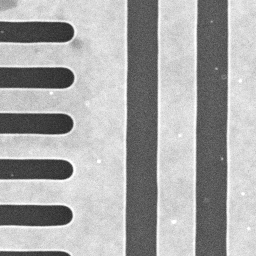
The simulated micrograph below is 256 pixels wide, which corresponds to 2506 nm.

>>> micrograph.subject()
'groups of lines, slits or small figures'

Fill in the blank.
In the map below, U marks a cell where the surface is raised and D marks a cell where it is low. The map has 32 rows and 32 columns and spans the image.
UUUUUUUUUUUUUUUUDDDDUUUUUDDDDUUU
UUUUUUUUUUUUUUUUDDDDUUUUUDDDDUUU
UUUUUUUUUUUUUUUUDDDDUUUUUDDDDUUU
DDDDDDDDDUUUUUUUDDDDUUUUUDDDDUUU
DDDDDDDDDUUUUUUUDDDDUUUUUDDDDUUU
UUUUUUUUUUUUUUUUDDDDUUUUUDDDDUUU
UUUUUUUUUUUUUUUUDDDDUUUUUDDDDUUU
UUUUUUUUUUUUUUUUDDDDUUUUUDDDDUUU
DDDDDDDDUUUUUUUUDDDDUUUUUDDDDUUU
DDDDDDDDDUUUUUUUDDDDUUUUUDDDDUUU
DDDDDDDDDUUUUUUUDDDDUUUUUDDDDUUU
UUUUUUUUUUUUUUUUDDDDUUUUUDDDDUUU
UUUUUUUUUUUUUUUUDDDDUUUUUDDDDUUU
UUUUUUUUUUUUUUUUDDDDUUUUUDDDDUUU
DDDDDDDDDUUUUUUUDDDDUUUUUDDDDUUU
DDDDDDDDDUUUUUUUDDDDUUUUDDDDUUUU
DDDDDDDDDUUUUUUUDDDDUUUUDDDDUUUU
UUUUUUUUUUUUUUUUDDDDUUUUDDDDUUUU
UUUUUUUUUUUUUUUUDDDDUUUUDDDDUUUU
UUUUUUUUUUUUUUUUDDDDUUUUDDDDUUUU
DDDDDDDDDUUUUUUUDDDDUUUUDDDDUUUU
DDDDDDDDDUUUUUUUDDDDUUUUDDDDUUUU
UUUUUUUUUUUUUUUUDDDDUUUUDDDDUUUU
UUUUUUUUUUUUUUUUDDDDUUUUDDDDUUUU
UUUUUUUUUUUUUUUUDDDDUUUUDDDDUUUU
UUUUUUUUUUUUUUUUDDDDUUUUDDDDUUUU
DDDDDDDDDUUUUUUUDDDDUUUUDDDDUUUU
DDDDDDDDDUUUUUUUDDDDUUUUDDDDUUUU
UUUUUUUUUUUUUUUUDDDDUUUUDDDDUUUU
UUUUUUUUUUUUUUUUDDDDUUUUDDDDUUUU
UUUUUUUUUUUUUUUUDDDDUUUUDDDDUUUU
DDDDDDDDUUUUUUUUDDDDUUUUDDDDUUUU